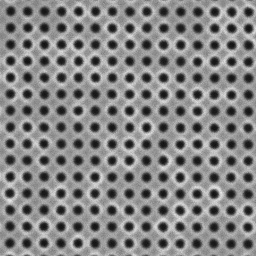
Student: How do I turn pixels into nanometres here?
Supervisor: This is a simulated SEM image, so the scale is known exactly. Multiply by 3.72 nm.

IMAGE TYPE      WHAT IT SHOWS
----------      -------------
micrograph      a regular array of holes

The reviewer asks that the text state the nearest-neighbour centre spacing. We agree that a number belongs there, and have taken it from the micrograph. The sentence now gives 61.2 nm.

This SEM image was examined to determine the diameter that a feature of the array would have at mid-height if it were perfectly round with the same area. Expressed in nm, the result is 37.8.